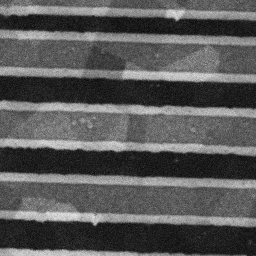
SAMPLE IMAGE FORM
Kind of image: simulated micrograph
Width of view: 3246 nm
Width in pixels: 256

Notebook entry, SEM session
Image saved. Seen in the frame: one or a few lines or trenches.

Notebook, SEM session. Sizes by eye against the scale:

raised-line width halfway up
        462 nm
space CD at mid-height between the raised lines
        0.442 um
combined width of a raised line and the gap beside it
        71.6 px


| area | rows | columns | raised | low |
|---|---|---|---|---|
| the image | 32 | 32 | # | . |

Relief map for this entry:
################################
................################
................................
................................
######..........................
################################
################################
################################
################################
.....................##..#######
................................
................................
................................
########........................
################################
################################
################################
################################
..........................######
................................
................................
................................
#########.......................
################################
################################
################################
################################
..........................######
................................
................................
................................
................................